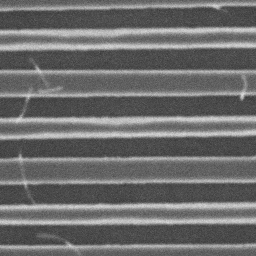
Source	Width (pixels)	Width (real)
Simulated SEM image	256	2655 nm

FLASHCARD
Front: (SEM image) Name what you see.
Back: lines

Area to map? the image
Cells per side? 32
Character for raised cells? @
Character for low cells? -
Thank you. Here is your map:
@@@@@@@@@@@@@@@@@@@@@@@@@@@@@@@@
--------------------------------
--------------------------------
--------------------------------
@@@@@@@@@@@@@@@@@@@@@@@@@@@@@@@@
@@@@@@@@@@@@@@@@@@@@@@@@@@@@@@@@
--------------------------------
--------------------------------
--------------------------------
@@@@@@@@@@@@@@@@@@@@@@@@@@@@@@@@
@@@@@@@@@@@@@@@@@@@@@@@@@@@@@@@@
@@@@@@@@@@@@@@@@@@@@@@@@@@@@@@@@
--------------------------------
--------------------------------
--------------------------------
@@@@@@@@@@@@@@@@@@@@@@@@@@@@@@@@
@@@@@@@@@@@@@@@@@@@@@@@@@@@@@@@@
--------------------------------
--------------------------------
--------------------------------
@@@@@@@@@@@@@@@@@@@@@@@@@@@@@@@@
@@@@@@@@@@@@@@@@@@@@@@@@@@@@@@@@
@@@@@@@@@@@@@@@@@@@@@@@@@@@@@@@@
--------------------------------
--------------------------------
--------------------------------
@@@@@@@@@@@@@@@@@@@@@@@@@@@@@@@@
@@@@@@@@@@@@@@@@@@@@@@@@@@@@@@@@
--------------------------------
--------------------------------
--------------------------------
@@@@@@@@@@@@@@@@@@@@@@@@@@@@@@@@